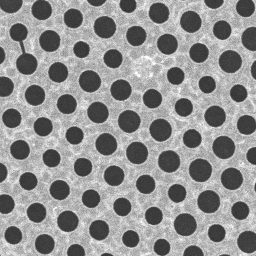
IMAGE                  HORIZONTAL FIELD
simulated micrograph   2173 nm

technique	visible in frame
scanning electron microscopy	a regular array of holes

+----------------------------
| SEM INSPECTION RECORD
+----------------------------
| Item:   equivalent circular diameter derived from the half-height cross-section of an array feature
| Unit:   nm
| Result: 169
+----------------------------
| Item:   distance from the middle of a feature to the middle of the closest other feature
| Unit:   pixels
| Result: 32.4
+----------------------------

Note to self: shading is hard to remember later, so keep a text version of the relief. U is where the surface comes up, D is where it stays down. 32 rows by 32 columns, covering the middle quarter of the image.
UUUUUUUUUUUDDDUUUUUUUUUUUUUUUUUU
DUUUUUUUUUUUUUUUUUUUUUUUUUDDDUUU
DUUUDDDDUUUUUUUUUUUUUUUUUUDDDDUU
DUUUDDDDDUUUUUUUUUUUUUUUUUDDDDUU
UUUUDDDDDUUUDDDDUUUUUUUUUUDDDUUU
UUUUDDDDDUUUDDDDDUUUUUUUUUUUUUUU
UUUUUDDDUUUUDDDDDUUUUDDUUUUUUUUU
UUUUUUUUUUUUDDDDDUUUDDDDUUUUUUUU
DDDUUUUUUUUUDDDDUUUUDDDDDUUUUUUU
DDDUUUUUDUUUUUUUUUUUDDDDUUUUDDDD
DDDUUUDDDDDUUUUUUUUUUDDDUUUUDDDD
DDDUUUDDDDDUUUUUDUUUUUUUUUUUDDDD
UUUUUUDDDDDUUUDDDDUUUUUUUUUUDDDD
UUUUUUDDDDDUUUDDDDDUUUUUUUUUUUUU
UUUUUUUDDDUUUDDDDDDUUUDDDDUUUUUU
UUUUUUUUUUUUUUDDDDDUUDDDDDDUUUUU
UDDDUUUUUUUUUUUDDDUUUDDDDDDUUUUD
DDDDDUUUUDDUUUUUUUUUUUDDDDDUUUDD
DDDDDUUUDDDDDUUUUUUUUUDDDDUUUUDD
UDDDUUUUDDDDDUUUUDDUUUUUUUUUUUDD
UUUUUUUUDDDDDUUUDDDDUUUUUUUUUUUD
UUUUUUUUDDDDDUUUDDDDDUUUUUUUUUUU
UUUUUUUUUDDDUUUUDDDDDUUUDDDDUUUU
UUUUDUUUUUUUUUUUDDDDDUUUDDDDDUUU
UUUDDDDUUUUUUUUUUDDDUUUUDDDDDUUU
UUUDDDDUUUUUDUUUUUUUUUUUDDDDDUUD
UUUDDDDUUUDDDDDUUUUUUUUUUDDDUUUD
UUUDDDUUUUDDDDDUUUUUUUUUUUUUUUUD
UUUUUUUUUUDDDDDUUUUDDDUUUUUUUUUU
UUUUUUUUUUDDDDDUUUDDDDDUUUUUUUUU
DUUUUUUUUUUUUUUUUUDDDDDUUUUDDDUU
DUUUUUDUUUUUUUUUUUUDDDUUUUDDDDUU